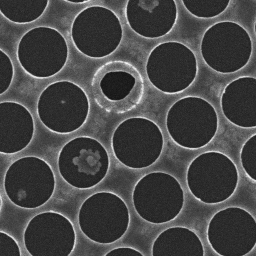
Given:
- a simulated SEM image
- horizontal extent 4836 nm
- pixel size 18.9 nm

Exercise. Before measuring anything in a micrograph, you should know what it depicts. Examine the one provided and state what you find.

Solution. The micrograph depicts a regular array of holes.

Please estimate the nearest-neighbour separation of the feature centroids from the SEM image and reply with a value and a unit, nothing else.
1090 nm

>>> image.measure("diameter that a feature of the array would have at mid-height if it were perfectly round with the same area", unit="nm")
960